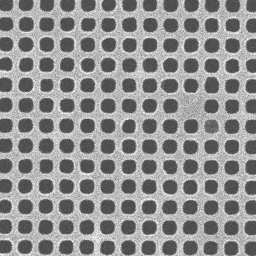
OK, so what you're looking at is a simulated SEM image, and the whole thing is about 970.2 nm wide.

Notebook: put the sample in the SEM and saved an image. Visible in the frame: a regular array of holes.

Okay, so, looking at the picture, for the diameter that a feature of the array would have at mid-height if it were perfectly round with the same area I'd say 57.9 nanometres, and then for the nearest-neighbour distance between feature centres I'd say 75.5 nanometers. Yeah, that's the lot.